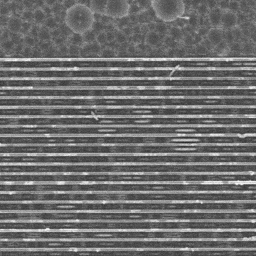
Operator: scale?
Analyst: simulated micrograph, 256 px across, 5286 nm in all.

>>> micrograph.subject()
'parallel lines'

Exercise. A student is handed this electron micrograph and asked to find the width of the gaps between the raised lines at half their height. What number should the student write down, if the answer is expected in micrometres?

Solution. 0.144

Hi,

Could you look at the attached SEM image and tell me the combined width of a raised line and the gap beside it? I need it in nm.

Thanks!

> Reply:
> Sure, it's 196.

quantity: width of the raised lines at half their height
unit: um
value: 0.0413